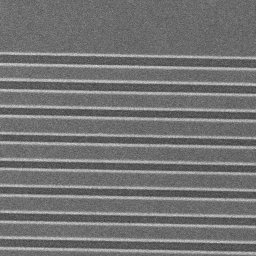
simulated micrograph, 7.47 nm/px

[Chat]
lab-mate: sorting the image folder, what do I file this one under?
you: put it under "parallel lines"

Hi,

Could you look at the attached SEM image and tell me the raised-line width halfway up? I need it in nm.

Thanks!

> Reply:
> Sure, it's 121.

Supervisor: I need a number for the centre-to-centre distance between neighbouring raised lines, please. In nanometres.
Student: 196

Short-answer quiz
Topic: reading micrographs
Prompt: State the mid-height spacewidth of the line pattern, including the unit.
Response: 71.9 nm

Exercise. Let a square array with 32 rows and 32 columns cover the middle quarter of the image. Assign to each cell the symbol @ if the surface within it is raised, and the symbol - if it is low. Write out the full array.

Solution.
@@@@@---------------------------
@@@@@@@@@@@@@@@@@@@@@@@@@@@@@@@@
@@@@@@@@@@@@@@@@@@@@@@@@@@@@@@@@
@@@@@@@@@@@@@@@@@@@@@@@@@@@@@@@@
---------------@@@@-------@@@@@@
--------------------------------
--------------------------------
@@@@@@@@@@@@@@@@@@@@@@----@@@@@@
@@@@@@@@@@@@@@@@@@@@@@@@@@@@@@@@
@@@@@@@@@@@@@@@@@@@@@@@@@@@@@@@@
@@@@@@@@@@@@@@@@@@@@@@@@@@@@@@@@
--------------------------------
--------------------------------
--------------------------------
@@@@@@@@@@@@@@@@@@@@@@@@@@@@@@@@
@@@@@@@@@@@@@@@@@@@@@@@@@@@@@@@@
@@@@@@@@@@@@@@@@@@@@@@@@@@@@@@@@
@@@@@@@@@@@@@@@@@@@@@@@@@@@@@@@@
--------------------------------
--------------------------------
@@@@@@@@@@@@@@@@@@------@@@@----
@@@@@@@@@@@@@@@@@@@@@@@@@@@@@@@@
@@@@@@@@@@@@@@@@@@@@@@@@@@@@@@@@
@@@@@@@@@@@@@@@@@@@@@@@@@@@@@@@@
---------------------------@@@@@
--------------------------------
--------------------------------
@@@@@@@@@@@@@@@@@@@@@@@@@@@@@@@@
@@@@@@@@@@@@@@@@@@@@@@@@@@@@@@@@
@@@@@@@@@@@@@@@@@@@@@@@@@@@@@@@@
@@@@@@@@@@@@@@@@@@@@@@@@@@@@@@@@
--------------------------------